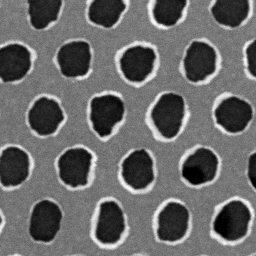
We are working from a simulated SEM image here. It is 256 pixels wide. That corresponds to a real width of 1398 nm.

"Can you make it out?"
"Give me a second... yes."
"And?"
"a regular array of holes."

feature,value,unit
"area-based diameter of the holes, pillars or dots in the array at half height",207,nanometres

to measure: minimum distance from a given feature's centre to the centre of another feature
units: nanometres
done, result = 328